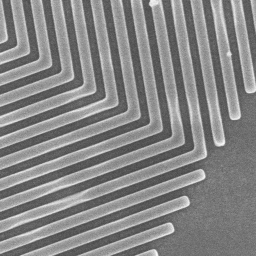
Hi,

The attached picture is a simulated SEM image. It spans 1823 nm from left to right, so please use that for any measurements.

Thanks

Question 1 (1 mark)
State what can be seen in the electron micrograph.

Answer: groups of lines, slits or small figures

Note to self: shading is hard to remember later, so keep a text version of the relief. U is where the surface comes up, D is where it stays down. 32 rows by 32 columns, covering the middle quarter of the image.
UUDDDUUDDDUUDDUUUDDUUUDDUUUDDUUU
UUDDDUUDDDUUDDDUUDDDUUDDDUUDDDUU
UUDDDUUDDDUUDDDUUDDDUUDDDUUDDDUU
UUDDDUUUDDUUDDDUUDDDUUUDDUUUDDUU
UDDDDUUUDDUUUDDUUUDDUUUDDUUUDDUU
DDDDDUUUDDUUUDDUUUDDUUUDDUUUDDUU
DDDUUUUUDDUUUDDUUUDDUUUDDUUUDDUU
UUUUUUUDDDDUUDDDUUDDUUUDDDUUDDDU
UUUDDDDDDDUUUDDDUUDDDUUDDDUUDDDU
UDDDDDDDDUUUUDDDUUUDDUUDDDUUDDDU
DDDDDDUUUUUUUDDDUUUDDUUUDDUUDDDU
DDDUUUUUUUDDDDDDUUUDDUUUDDDUDDDU
UUUUUUUDDDDDDDUUUUUDDUUUDDDUUDDD
UUUUUDDDDDDDUUUUUUUDDDUUDDDUUDDD
UUDDDDDDDUUUUUUUDDDDDDUUDDDUUDDD
DDDDDDUUUUUUUUDDDDDDDUUUUDDUUUDD
DDDUUUUUUUUDDDDDDDUUUUUUDDDUUUDD
DUUUUUUUDDDDDDDUUUUUUUUDDDDUUUDD
UUUUUUDDDDDDUUUUUUUUDDDDDDUUUUDD
UUDDDDDDDDUUUUUUUDDDDDDDUUUUUUDD
DDDDDDDUUUUUUUDDDDDDDUUUUUUUUDDD
DDDDUUUUUUUUDDDDDDDUUUUUUUDDDDDD
DUUUUUUUUDDDDDDDUUUUUUUDDDDDDDUU
UUUUUUDDDDDDDUUUUUUUUDDDDDDUUUUU
UUUUDDDDDDDUUUUUUUDDDDDDDUUUUUUU
UDDDDDDDUUUUUUUDDDDDDDUUUUUUUDDD
DDDDDUUUUUUUUDDDDDDUUUUUUUUDDDDD
DDUUUUUUUUDDDDDDUUUUUUUUDDDDDDDU
UUUUUUUDDDDDDDUUUUUUUDDDDDDDUUUU
UUUUDDDDDDDUUUUUUUUDDDDDDUUUUUUU
UDDDDDDDUUUUUUUUDDDDDDUUUUUUUUDD
DDDDDDUUUUUUUDDDDDDUUUUUUUUDDDDD